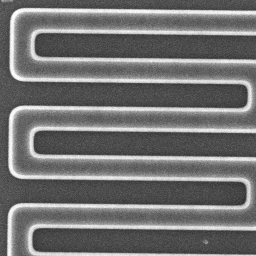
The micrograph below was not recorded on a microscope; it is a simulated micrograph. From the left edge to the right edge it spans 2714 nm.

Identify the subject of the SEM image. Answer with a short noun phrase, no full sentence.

groups of lines, slits or small figures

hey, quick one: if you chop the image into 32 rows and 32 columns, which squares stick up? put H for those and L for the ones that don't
LLLLLLLLLLLLLLLLLLLLLLLLLLLLLLLL
LLHHHHHHHHHHHHHHHHHHHHHHHHHLLLLL
LLHHHHHHHHHHHHHHHHHHHHHHHHHHHHHH
LLHHHHHHHHHHHHHHHHHHHHHHHHHHHHHH
LLHHLLLLLLLLLLLLLLLLLLLLLLLLLLLL
LHHHLLLLLLLLLLLLLLLLLLLLLLLLLLLL
LHHHLLLLLLLLLLLLLLLLLLLLLLLLLLLL
LHHHHHHHHHHHHHHHLLLLLLLLLLLLLLLL
LHHHHHHHHHHHHHHHHHHHHHHHHHHHHHHH
LLHHHHHHHHHHHHHHHHHHHHHHHHHHHHHH
LLLLLLLLLLLLLLLLLLLLLLLLLLLLLLLH
LLLLLLLLLLLLLLLLLLLLLLLLLLLLLLLH
LLLLLLLLLLLLLLLLLLLLLLLLLLLLLLLH
LLLHHHLLLLLLLLLLLLLLLLLLLLLLLLLH
LHHHHHHHHHHHHHHHHHHHHHHHHHHHHHHH
LHHHHHHHHHHHHHHHHHHHHHHHHHHHHHHH
LHHHLLLLLLLLLLLLLLLLLLLLLLLLLLLL
LHHHLLLLLLLLLLLLLLLLLLLLLLLLLLLL
LHHHLLLLLLLLLLLLLLLLLLLLLLLLLLLL
LHHHHLLLLLLLLLLLLLLLLLLLLLLLLLLL
LHHHHHHHHHHHHHHHHHHHHHHHHHHHHHHH
LLHHHHHHHHHHHHHHHHHHHHHHHHHHHHHH
LLLLLLLLLLLLLLLLLLLLLLLLLLLLLLHH
LLLLLLLLLLLLLLLLLLLLLLLLLLLLLLLH
LLLLLLLLLLLLLLLLLLLLLLLLLLLLLLLH
LLLLLLLLLLLLLLLLLLLLLLLLLLLLLLLH
LHHHHHHHHHHHHHHHHHHHHHHHHHHHHHHH
LHHHHHHHHHHHHHHHHHHHHHHHHHHHHHHH
LHHHLLLLLLLLLLLLLLLLLLLLLLLLLLHH
LHHHLLLLLLLLLLLLLLLLLLLLLLLLLLLL
LHHHLLLLLLLLLLLLLLLLLLLLLLLLLLLL
LHHHLLLLLLLLLLLLLLLLLLLLLLLLLLLL